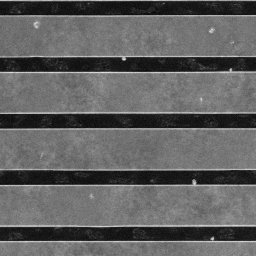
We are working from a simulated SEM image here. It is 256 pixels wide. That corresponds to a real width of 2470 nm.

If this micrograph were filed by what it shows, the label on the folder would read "parallel lines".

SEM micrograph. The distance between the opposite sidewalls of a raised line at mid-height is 402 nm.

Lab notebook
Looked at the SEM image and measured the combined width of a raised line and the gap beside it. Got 545 nanometers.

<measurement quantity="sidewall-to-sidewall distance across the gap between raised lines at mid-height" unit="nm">142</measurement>